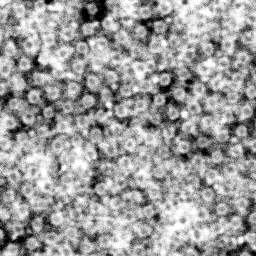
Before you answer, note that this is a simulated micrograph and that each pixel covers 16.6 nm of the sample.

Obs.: a regular array of raised bodies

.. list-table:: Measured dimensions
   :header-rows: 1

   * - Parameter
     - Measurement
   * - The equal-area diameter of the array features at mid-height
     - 0.157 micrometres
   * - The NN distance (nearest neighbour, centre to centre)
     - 325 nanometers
